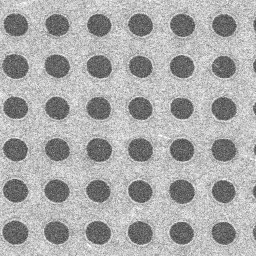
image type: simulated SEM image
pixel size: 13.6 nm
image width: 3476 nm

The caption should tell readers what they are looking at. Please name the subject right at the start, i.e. a regular array of holes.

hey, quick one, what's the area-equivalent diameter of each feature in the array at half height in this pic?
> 339 nanometers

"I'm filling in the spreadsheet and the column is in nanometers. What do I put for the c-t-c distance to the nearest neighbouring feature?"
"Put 562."